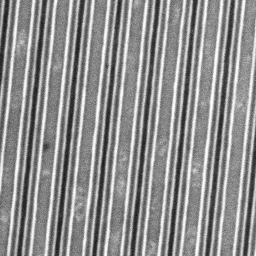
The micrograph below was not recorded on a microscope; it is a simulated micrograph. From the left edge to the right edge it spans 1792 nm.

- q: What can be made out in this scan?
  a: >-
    parallel lines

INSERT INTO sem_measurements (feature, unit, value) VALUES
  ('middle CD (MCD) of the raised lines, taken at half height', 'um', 0.06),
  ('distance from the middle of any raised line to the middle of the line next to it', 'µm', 0.131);